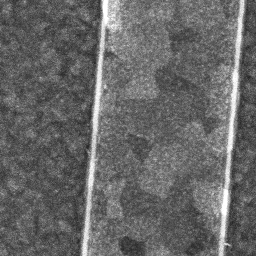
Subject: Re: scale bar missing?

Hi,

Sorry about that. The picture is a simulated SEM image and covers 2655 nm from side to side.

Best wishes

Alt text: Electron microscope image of one or a few lines or trenches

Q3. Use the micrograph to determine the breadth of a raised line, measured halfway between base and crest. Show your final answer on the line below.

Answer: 1400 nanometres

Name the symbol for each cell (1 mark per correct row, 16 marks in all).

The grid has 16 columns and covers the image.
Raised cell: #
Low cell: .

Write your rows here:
.......########.
......#########.
......#########.
......#########.
......#########.
......#########.
......#########.
......########..
......########..
......########..
......########..
......########..
......########..
.....#########..
.....#########..
.....#########..